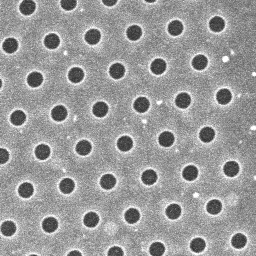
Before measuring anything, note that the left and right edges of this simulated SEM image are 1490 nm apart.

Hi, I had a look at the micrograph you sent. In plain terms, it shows a regular array of holes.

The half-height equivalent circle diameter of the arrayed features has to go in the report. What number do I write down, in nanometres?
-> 100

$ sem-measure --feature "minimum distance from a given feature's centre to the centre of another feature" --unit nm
240